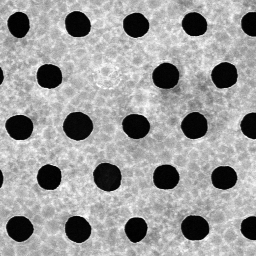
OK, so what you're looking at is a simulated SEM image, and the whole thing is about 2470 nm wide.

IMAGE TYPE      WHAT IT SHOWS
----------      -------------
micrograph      a regular array of holes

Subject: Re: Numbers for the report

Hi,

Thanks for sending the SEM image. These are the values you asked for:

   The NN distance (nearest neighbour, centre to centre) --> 58.1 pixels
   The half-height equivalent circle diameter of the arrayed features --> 254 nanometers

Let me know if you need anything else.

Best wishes